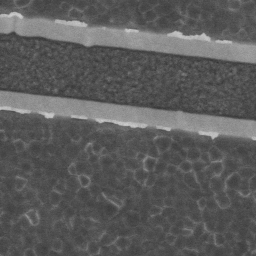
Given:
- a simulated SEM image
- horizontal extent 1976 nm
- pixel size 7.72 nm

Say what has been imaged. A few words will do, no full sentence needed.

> one or a few lines or trenches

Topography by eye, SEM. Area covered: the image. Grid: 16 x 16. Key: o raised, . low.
oooooooooooooooo
.ooooooooooooooo
.........ooooooo
................
................
................
oo..............
oooooooooo......
oooooooooooooooo
oooooooooooooooo
oooooooooooooooo
oooooooooooooooo
oooooooooooooooo
oooooooooooooooo
oooooooooooooooo
oooooooooooooooo